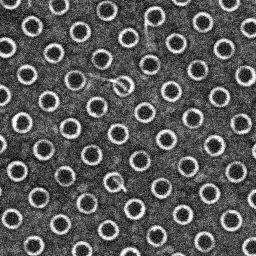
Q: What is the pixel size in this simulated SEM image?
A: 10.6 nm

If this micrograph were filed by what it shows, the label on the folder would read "a regular array of raised bodies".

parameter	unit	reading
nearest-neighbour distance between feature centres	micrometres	0.359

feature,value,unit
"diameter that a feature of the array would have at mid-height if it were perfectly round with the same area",206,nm